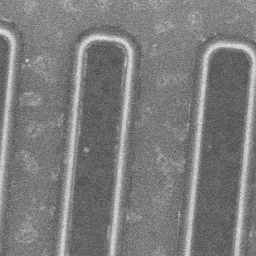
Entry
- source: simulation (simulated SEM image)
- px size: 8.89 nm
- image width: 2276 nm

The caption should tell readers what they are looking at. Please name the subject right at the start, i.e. one or a few lines or trenches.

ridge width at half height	431	nanometres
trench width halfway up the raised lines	671	nm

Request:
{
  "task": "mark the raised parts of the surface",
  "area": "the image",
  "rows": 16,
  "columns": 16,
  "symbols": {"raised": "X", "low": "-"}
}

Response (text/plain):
----------------
----------------
X-----X---------
X----XXX-----XXX
X----XXX-----XXX
X----XXX-----XXX
-----XXX-----XXX
-----XXX-----XXX
-----XXX----XXX-
----XXXX----XXX-
----XXXX----XXX-
----XXX-----XXX-
----XXX-----XXX-
----XXX-----XXX-
----XXX-----XXX-
----XXX-----XXX-